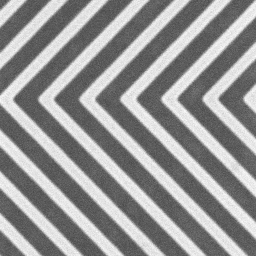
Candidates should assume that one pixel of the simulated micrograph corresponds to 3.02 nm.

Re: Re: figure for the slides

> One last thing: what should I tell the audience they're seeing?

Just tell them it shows groups of lines, slits or small figures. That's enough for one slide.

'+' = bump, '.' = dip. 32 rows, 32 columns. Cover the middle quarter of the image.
..+++.......+++.......++++......
++++.......+++.......++++......+
+++.......++++......++++......++
++.......++++......++++......+++
+.......+++.......++++......++++
.......++++......++++......++++.
......++++......++++......++++..
.....+++.......++++......++++...
....++++......++++......++++....
....++++.......+++.......++++...
.....++++......++++.......+++...
......++++......++++.......+++..
+......++++.......+++.......++++
++......++++......++++.......+++
+++......++++......++++.......++
++++......++++......++++.......+
.++++......++++......++++.......
..++++......++++......++++......
...++++......++++......++++.....
....++++......++++......++++....
.....++++......++++......++++...
......++++......++++......++++..
.......+++.......++++......++++.
+.......+++.......++++......++++
++.......+++.......++++......+++
+++.......+++.......++++......++
++++.......+++.......++++......+
.++++......++++.......++++......
..++++.......+++.......++++.....
...++++......++++.......++++....
....++++.......+++.......++++...
.....++++.......+++.......+++...